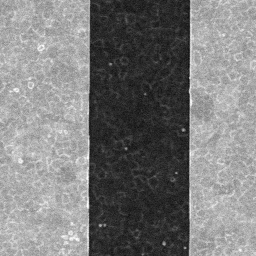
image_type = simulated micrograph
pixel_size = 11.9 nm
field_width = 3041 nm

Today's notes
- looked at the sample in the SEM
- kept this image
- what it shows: one or a few lines or trenches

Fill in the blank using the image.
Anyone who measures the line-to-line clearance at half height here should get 1.21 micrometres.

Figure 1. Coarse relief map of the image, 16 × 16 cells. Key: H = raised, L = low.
HHHHHHLLLLLLHHHH
HHHHHHLLLLLLHHHH
HHHHHHLLLLLLHHHH
HHHHHHLLLLLLHHHH
HHHHHHLLLLLLHHHH
HHHHHHLLLLLLHHHH
HHHHHHLLLLLLHHHH
HHHHHHLLLLLLHHHH
HHHHHHLLLLLLHHHH
HHHHHHLLLLLLHHHH
HHHHHLLLLLLLHHHH
HHHHHLLLLLLLHHHH
HHHHHLLLLLLLHHHH
HHHHHLLLLLLLHHHH
HHHHHHLLLLLLHHHH
HHHHHHLLLLLLHHHH